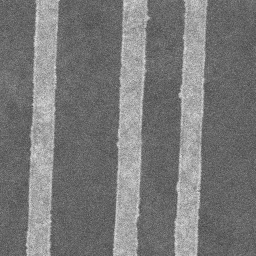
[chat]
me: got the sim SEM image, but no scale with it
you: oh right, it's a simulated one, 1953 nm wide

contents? one or a few lines or trenches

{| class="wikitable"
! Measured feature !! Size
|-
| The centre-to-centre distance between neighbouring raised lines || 74.2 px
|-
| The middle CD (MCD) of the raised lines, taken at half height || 22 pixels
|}